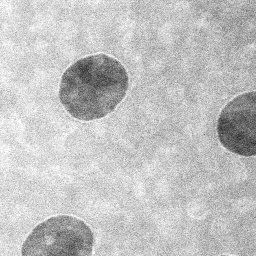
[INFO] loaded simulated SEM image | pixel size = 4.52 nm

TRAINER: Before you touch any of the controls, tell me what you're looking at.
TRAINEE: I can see raised bodies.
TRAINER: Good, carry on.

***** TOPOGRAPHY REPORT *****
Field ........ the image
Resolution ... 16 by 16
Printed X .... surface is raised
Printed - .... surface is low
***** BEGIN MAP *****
----------------
----------------
----------------
-----XX---------
----XXXX--------
----XXXX--------
----XXX-------XX
----XX--------XX
--------------XX
--------------XX
----------------
----------------
----------------
---XX-----------
--XXXX----------
-XXXXX----------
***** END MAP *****